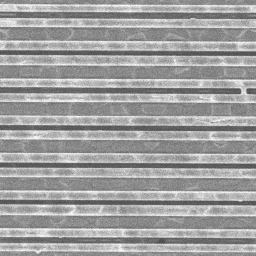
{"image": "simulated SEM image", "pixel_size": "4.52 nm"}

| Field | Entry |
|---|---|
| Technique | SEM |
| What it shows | parallel lines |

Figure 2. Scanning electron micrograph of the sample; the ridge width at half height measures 39.5 nm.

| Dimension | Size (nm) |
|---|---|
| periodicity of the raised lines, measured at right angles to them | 83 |